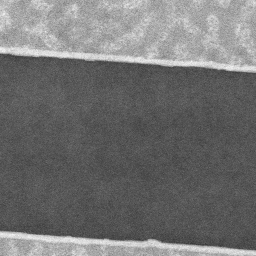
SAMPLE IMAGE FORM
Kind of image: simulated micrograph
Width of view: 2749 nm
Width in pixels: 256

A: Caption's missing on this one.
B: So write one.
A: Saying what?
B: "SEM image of one or a few lines or trenches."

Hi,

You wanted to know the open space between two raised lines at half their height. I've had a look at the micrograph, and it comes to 1.97 micrometres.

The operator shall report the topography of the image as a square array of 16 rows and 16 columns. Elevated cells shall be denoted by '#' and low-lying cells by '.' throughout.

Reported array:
################
################
################
.....###########
................
................
................
................
................
................
................
................
................
................
................
############....